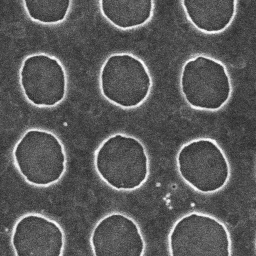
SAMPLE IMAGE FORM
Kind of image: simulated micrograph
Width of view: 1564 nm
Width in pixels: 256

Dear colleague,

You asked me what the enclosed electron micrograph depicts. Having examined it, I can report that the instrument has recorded holes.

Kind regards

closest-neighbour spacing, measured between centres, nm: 491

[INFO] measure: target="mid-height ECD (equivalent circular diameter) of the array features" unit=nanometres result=303